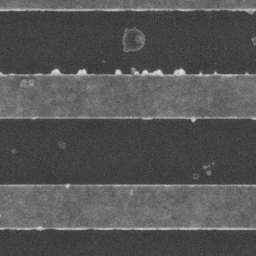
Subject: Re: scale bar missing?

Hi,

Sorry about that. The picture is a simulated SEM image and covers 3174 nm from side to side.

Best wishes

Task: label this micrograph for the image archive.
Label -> lines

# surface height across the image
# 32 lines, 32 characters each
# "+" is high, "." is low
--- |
++++++++++++++++++++++++++++++++
................................
................................
................................
................................
................................
................................
................................
................................
++++++++++++++++++++++++++++++++
++++++++++++++++++++++++++++++++
++++++++++++++++++++++++++++++++
++++++++++++++++++++++++++++++++
++++++++++++++++++++++++++++++++
++++++++++++++++++++++++++++++++
................................
................................
................................
................................
................................
................................
................................
................................
++++++++++++++++++++++++++++++++
++++++++++++++++++++++++++++++++
++++++++++++++++++++++++++++++++
++++++++++++++++++++++++++++++++
++++++++++++++++++++++++++++++++
++++++++++++++++++++++++++++++++
................................
................................
................................